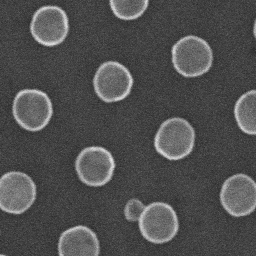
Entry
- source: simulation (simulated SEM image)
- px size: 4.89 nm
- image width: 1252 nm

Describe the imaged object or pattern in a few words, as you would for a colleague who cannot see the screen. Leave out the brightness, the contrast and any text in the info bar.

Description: raised bodies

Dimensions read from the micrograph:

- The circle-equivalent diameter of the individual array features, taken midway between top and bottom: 190 nanometers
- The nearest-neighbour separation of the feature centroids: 0.413 um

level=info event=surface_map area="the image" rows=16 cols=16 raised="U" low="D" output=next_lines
DDDDDDDUUDDDDDDD
DDUUDDDDDDDDDDDD
DDUUDDDDDDDUUDDD
DDDDDDDDDDDUUDDD
DDDDDDUUDDDUUDDD
DDDDDDUUDDDDDDDD
DUUDDDDDDDDDDDDU
DUUDDDDDDDDDDDDU
DDDDDDDDDDUUDDDD
DDDDDUUDDDUUDDDD
DDDDDUUDDDDDDDDD
UUDDDDDDDDDDDDUU
UUDDDDDDDDDDDDUU
DDDDDDDDDUUDDDDD
DDDDUUDDDUUDDDDD
DDDDUUDDDDDDDDDD